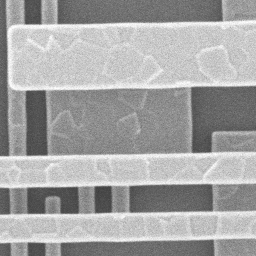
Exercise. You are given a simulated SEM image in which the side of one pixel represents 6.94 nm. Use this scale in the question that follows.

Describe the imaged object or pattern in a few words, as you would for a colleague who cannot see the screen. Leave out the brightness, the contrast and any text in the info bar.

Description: wiring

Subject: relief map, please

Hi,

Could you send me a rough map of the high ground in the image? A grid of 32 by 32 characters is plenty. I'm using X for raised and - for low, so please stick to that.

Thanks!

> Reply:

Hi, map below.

--------------------------------
--------------------------------
--------------------------------
-XXXXXXXXXXXXXXXXXXXXXXXXXXXXXXX
-XXXXXXXXXXXXXXXXXXXXXXXXXXXXXXX
-XXXXXXXXXXXXXXXXXXXXXXXXXXXXXXX
-XXXXXXXXXXXXXXXXXXXXXXXXXXXXXXX
-XXXXXXXXXXXXXXXXXXXXXXXXXXXXXXX
-XXXXXXXXXXXXXXXXXXXXXXXXXXXXXXX
-XXXXXXXXXXXXXXXXXXXXXXXXXXXXXXX
-XXXXXXXXXXXXXXXXXXXXXXXXXXXXXXX
--------------------------------
--------------------------------
--------------------------------
--------------------------------
--------------------------------
--------------------------------
--------------------------------
--------------------------------
---------XXXXXXXXXXXXXXXXXXXXXXX
XXXXXXXXXXXXXXXXXXXXXXXXXXXXXXXX
XXXXXXXXXXXXXXXXXXXXXXXXXXXXXXXX
XXXXXXXXXXXXXXXXXXXXXXXXXXXXXXXX
--------------------------------
--------------------------------
--------------------------------
-------------------------------X
XXXXXXXXXXXXXXXXXXXXXXXXXXXXXXXX
XXXXXXXXXXXXXXXXXXXXXXXXXXXXXXXX
XXXXXXXXXXXXXXXXXXXXXXXXXXXXXXXX
--------------------------------
--------------------------------